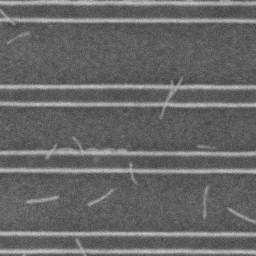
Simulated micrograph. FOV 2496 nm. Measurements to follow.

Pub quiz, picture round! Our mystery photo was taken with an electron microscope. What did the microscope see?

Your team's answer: lines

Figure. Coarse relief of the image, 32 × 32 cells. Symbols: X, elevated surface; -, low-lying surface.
XXXXXXXXXXXXXXXXXXXXXXXXXXXXXXXX
XXXXXXXXXXXXXXXXXXXXXXXXXXXXXXXX
XXXXXXXXXXXXXXXXXXXXXXXXXXXXXXXX
--------------------------------
--------------------------------
--------------------------------
--------------------------------
--------------------------------
--------------------------------
--------------------------------
--------------------------------
XXXXXXXXXXXXXXXXXXXXXXXXXXXXXXXX
XXXXXXXXXXXXXXXXXXXXXXXXXXXXXXXX
--------------------------------
--------------------------------
--------------------------------
--------------------------------
--------------------------------
--------------------------------
XXXXXXXXXXXXXXXXXXXXXXXXXXXXXXXX
XXXXXXXXXXXXXXXXXXXXXXXXXXXXXXXX
--------------------------------
--------------------------------
--------------------------------
--------------------------------
--------------------------------
--------------------------------
--------------------------------
--------------------------------
XXXXXXXXXXXXXXXXXXXXXXXXXXXXXXXX
XXXXXXXXXXXXXXXXXXXXXXXXXXXXXXXX
----------X---------------XXXXXX